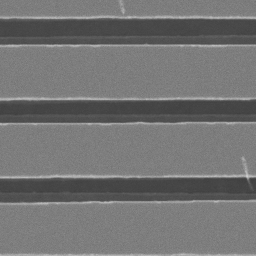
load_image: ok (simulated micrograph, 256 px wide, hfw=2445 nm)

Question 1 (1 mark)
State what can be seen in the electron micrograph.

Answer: lines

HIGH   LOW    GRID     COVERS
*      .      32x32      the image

********************************
********************************
................................
................................
................................
................................
********************************
********************************
********************************
********************************
********************************
********************************
**.**...........................
................................
................................
********************************
********************************
********************************
********************************
********************************
********************************
********************************
................................
................................
................................
********************************
********************************
********************************
********************************
********************************
********************************
********************************